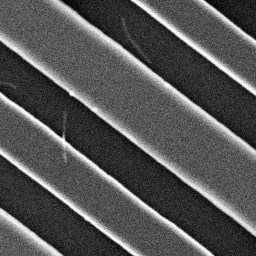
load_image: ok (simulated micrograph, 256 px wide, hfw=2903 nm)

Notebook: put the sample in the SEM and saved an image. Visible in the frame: lines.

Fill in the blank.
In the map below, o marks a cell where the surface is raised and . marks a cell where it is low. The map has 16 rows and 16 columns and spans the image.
oooo.....oooo...
ooooo.....ooooo.
ooooooo....ooooo
.ooooooo.....ooo
...oooooo.....oo
....ooooooo....o
o....ooooooo....
oo.....oooooo...
oooo....ooooooo.
ooooo....ooooooo
.ooooo.....ooooo
...ooooo....oooo
....ooooo....ooo
o....ooooo.....o
oo....ooooo.....
ooo.....ooooo...